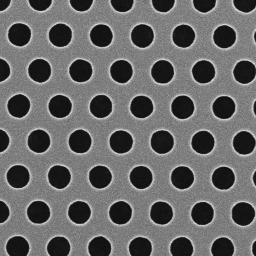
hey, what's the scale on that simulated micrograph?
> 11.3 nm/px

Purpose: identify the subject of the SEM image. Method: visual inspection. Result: a regular array of holes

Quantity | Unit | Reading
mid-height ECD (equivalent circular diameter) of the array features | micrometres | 0.261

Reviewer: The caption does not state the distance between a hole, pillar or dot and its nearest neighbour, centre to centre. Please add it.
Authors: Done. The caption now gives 460 nm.